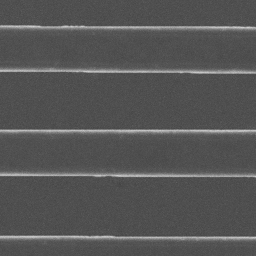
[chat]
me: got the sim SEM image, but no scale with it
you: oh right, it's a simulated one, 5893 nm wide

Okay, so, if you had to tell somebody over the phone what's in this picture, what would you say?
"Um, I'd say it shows lines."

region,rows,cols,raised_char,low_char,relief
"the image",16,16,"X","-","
----------------
----------------
XXXXXXXXXXXXXXXX
XXXXXXXXXXXXXXXX
------------XXXX
----------------
----------------
----------------
XXXXXXXXXXXXXXXX
XXXXXXXXXXXXXXXX
XXXXXXXXXXXXXXXX
----------------
----------------
----------------
----------------
XXXXXXXXXXXXXXXX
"